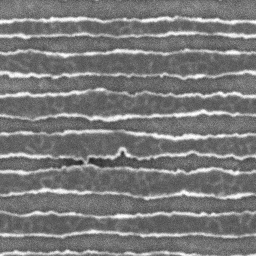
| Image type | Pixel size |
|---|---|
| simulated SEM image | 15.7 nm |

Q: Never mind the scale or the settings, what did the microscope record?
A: parallel lines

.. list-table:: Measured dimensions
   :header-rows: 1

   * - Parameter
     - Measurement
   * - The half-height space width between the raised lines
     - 268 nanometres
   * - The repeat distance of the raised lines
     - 39.3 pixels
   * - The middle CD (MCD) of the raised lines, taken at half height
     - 349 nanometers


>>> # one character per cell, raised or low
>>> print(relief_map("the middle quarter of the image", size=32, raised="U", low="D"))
UUUUUUUUUUUUUUUUUUUUUUUUUUUUUUUU
UUUUUUUUUUUUUUUUUUUUUUUUUUUUUUUU
UUUUUUUUUUUUUUUUUUUUUUUUUUUUUUUU
DDDDDDDDDDDDDDDDDDDDDDDDDDDDDUUD
DDDDDDDDDDDDDDDDDDDDDDDDDDDDDDDD
DDDDDDDDDDDDDDDDDDDDDDDDDDDDDDDD
DDDDDDUDUUUDDDDDDDDDDDDDDDDDDDDD
DUUUUUUUUUUUUUUUDDUUUUUDDDUDDDDD
UUUUUUUUUUUUUUUUUUUUUUUUUUUUUUUU
UUUUUUUUUUUUUUUUUUUUUUUUUUUUUUUU
UUUUUUUUUUUUUUUUUUUUUUUUUUUUUUUU
UUUUUUUUUUUUUUUUUUUUUUUUUUUUUUUU
UUUUUUUUUUUUUUUUUUUUUUUUUUUUUUUU
DDDDDDUUUUUUUDDDDDDDDDDDDDDDDDDD
DDDDDDDDDDDDDDDDDDDDDDDDDDDDDDDD
DDDDDDDDDDDDDDDDDDDDDDDDDDDDDDDD
DDDDDDDDDDDDDDDDDDDDDDDDDDDDDDDD
UUUUUUUUUUUUUUUUUUUUUUDDDDDDDDDD
UUUUUUUUUUUUUUUUUUUUUUUUUUUDUUUU
UUUUUUUUUUUUUUUUUUUUUUUUUUUUUUUU
UUUUUUUUUUUUUUUUUUUUUUUUUUUUUUUU
UUUUUUUUUUUUUUUUUUUUUUUUUUUUUUUU
UUUUUUUUUUUUUUDUUUUUUUUUUUUUUUUD
DDUUUUDDDDDDDDDDDDUUUUDDDDDDDDDD
DDDDDUDDDDDDDDDDDDDDDDDDDDDDDDDD
DDDDUUUUDDDDDDDDDDDDDDDDDDDDDDDD
UUUUUUUUUUUUUUUUUUUUUDUDDDDDDDDD
UUUUUUUUUUUUUUUUUUUUUUUUUUUUUUUU
UUUUUUUUUUUUUUUUUUUUUUUUUUUUUUUU
UUUUUUUUUUUUUUUUUUUUUUUUUUUUUUUU
UUUUUUUUUUUUUUUUUUUUUUUUUUUUUUUU
UUUUUUUUUUUUUUUUUUUUUUUUUUUUUUUU